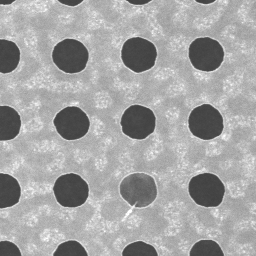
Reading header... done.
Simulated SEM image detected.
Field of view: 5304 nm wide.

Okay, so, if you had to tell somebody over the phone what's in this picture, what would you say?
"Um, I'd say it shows a regular array of holes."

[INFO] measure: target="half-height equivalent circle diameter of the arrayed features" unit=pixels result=35.4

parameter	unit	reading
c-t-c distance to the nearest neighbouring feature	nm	1390